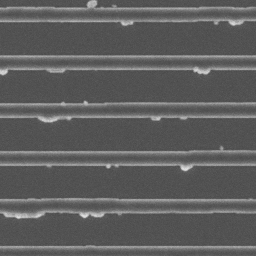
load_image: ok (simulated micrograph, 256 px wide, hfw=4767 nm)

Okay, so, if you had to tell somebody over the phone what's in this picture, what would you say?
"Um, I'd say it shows lines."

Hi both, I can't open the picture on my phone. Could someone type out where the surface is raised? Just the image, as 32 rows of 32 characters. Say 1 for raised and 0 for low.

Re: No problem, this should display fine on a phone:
00000000000100000000000000000000
11111111111111111111111111111111
11111111111111111111111111111111
00000000000000000000000000000000
00000000000000000000000000000000
00000000000000000000000000000000
00000000000000000000000000000000
11111111111111111111111111111111
11111111111111111111111111111111
00000000000000000000000000000000
00000000000000000000000000000000
00000000000000000000000000000000
00000000000000000000000000000000
11111111111111111111111111111111
11111111111111111111111111111111
00000000000000000000000000000000
00000000000000000000000000000000
00000000000000000000000000000000
00000000000000000000000000000000
11111111111111111111111111111111
11111111111111111111111111111111
00000000000000000000000000000000
00000000000000000000000000000000
00000000000000000000000000000000
00000000000000000000000000000000
11111111111111111111111111111111
11111100111111111111001111100011
00000000000000000000000000000000
00000000000000000000000000000000
00000000000000000000000000000000
00000000000000000000000000000000
11111111111111111111111111111111